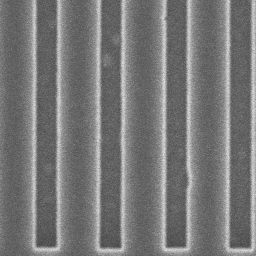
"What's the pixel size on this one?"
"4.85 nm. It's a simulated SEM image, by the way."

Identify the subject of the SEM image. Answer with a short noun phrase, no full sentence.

one or a few lines or trenches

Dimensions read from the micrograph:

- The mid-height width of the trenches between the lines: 23 pixels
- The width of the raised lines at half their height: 201 nm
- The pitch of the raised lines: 315 nm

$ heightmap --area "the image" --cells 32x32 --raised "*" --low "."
****...*****...******...*****...
****...*****...******...*****...
****...*****...******...*****...
****...*****...******...*****...
****...*****...******...*****...
****...*****...******...*****...
****...*****...******...*****...
****...*****...******...*****...
****...*****...******...*****...
****...*****...******...*****...
****...*****...******...*****...
****...*****...******...*****...
****...*****...******...*****...
****...*****...******...*****...
****...*****...******...*****...
****...*****...******...*****...
****...*****...******...*****...
****...*****...******...*****...
****...*****...******...*****...
****...*****...******...*****...
****...*****...******...*****...
****...*****...******...*****...
****...*****...******...*****...
****...*****...******...****....
****...*****...******...****....
****...*****...******...****....
****...*****...******...****....
****...*****...******...****....
****...*****...******...****....
****...*****...******...****....
****...*****...******...****....
********************************